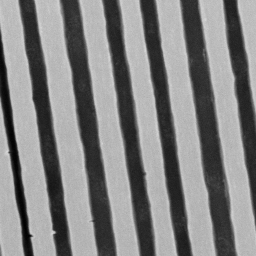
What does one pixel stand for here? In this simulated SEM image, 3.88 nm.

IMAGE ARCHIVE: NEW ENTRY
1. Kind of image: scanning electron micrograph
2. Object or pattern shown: parallel lines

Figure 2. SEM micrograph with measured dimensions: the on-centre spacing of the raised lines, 156 nanometres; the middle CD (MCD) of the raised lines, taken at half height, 87.3 nm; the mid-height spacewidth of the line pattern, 63.8 nanometres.